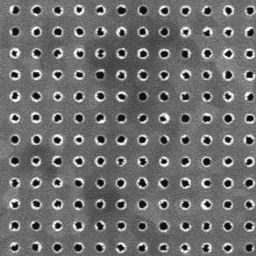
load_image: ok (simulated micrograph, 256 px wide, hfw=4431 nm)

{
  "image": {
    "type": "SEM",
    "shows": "a regular array of holes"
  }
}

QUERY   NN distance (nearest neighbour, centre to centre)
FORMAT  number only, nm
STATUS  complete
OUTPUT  363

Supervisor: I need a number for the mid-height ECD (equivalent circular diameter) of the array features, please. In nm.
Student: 128